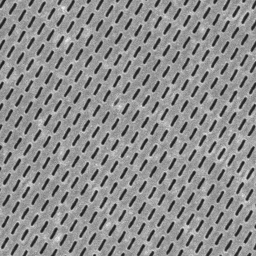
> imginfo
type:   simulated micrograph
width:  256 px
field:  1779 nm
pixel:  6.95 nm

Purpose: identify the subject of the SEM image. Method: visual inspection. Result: a regular array of holes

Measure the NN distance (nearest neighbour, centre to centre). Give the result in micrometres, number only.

0.0798